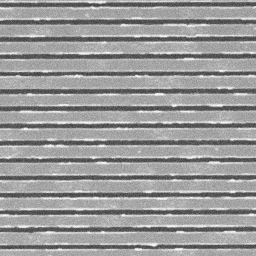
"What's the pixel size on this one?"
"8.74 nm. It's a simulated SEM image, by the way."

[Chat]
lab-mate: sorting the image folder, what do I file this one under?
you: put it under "parallel lines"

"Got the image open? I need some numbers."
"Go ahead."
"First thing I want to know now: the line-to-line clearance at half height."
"47 nm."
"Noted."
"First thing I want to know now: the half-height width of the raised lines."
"109 nm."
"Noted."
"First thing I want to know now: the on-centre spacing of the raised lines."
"151 nm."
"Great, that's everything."